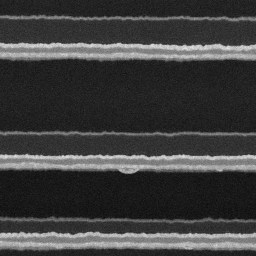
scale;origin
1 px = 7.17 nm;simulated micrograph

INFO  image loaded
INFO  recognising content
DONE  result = lines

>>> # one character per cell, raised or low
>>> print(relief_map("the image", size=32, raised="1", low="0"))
00000000000000000000000000000000
00000000000000000000000000000000
11111111111111111111111111111111
11111111111111111111111111111111
11111111111111111111111111111111
11111111111111111111111111111111
11111111111111111111111111111111
00000000000000000000000000000000
00000000000000000000000000000000
00000000000000000000000000000000
00000000000000000000000000000000
00000000000000000000000000000000
00000000000000000000000000000000
00000000000000000000000000000000
00000000000000000000000000000000
00000000000000000000000000000000
00000000000000000000000000000000
11111111111111111111111111111111
11111111111111111111111111111111
11111111111111111111111111111111
11111111111111111111111111111111
00000000000000011000000000000000
00000000000000000000000000000000
00000000000000000000000000000000
00000000000000000000000000000000
00000000000000000000000000000000
00000000000000000000000000000000
11111011010000110000000000000000
11111111111111111111111111111111
11111111111111111111111111111111
11111111111111111111111111111111
00000000000000000000000000000000